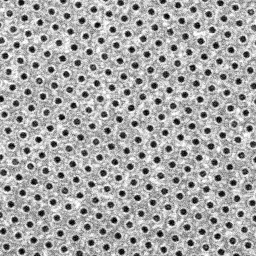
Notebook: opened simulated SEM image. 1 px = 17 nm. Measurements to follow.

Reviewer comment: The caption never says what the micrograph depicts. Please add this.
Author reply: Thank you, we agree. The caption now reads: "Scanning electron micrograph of a regular array of holes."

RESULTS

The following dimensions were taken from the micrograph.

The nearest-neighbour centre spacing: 270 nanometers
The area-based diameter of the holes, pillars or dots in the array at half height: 132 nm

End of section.